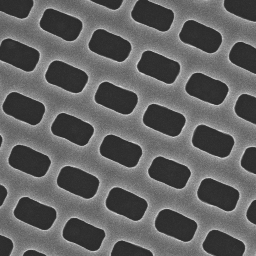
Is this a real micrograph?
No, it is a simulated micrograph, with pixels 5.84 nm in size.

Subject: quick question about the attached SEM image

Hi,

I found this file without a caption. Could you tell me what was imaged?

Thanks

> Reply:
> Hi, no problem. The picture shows a regular array of holes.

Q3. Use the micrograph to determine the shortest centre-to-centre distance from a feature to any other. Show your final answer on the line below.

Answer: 0.308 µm